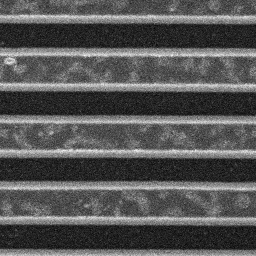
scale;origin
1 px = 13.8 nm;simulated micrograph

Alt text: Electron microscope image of one or a few lines or trenches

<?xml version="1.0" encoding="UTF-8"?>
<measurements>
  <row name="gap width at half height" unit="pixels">32.5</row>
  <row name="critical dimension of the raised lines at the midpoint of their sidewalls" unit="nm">484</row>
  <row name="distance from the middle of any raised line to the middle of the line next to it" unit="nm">920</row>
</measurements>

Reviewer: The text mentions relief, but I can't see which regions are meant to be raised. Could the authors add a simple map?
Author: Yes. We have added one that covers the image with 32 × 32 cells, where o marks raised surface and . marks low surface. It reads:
oooooooooooooooooooooooooooooooo
oooooooooooooooooooooooooooooooo
................................
................................
................................
................................
................................
oooooooooooooooooooooooooooooooo
oooooooooooooooooooooooooooooooo
oooooooooooooooooooooooooooooooo
oooooooooooooooooooooooooooooooo
................................
................................
................................
................................
oooooooooooooooooooooooooooooooo
oooooooooooooooooooooooooooooooo
oooooooooooooooooooooooooooooooo
oooooooooooooooooooooooooooooooo
................................
................................
................................
................................
oooooooooooooooooooooooooooooooo
oooooooooooooooooooooooooooooooo
oooooooooooooooooooooooooooooooo
oooooooooooooooooooooooooooooooo
ooo..........ooooooooooooooooooo
................................
................................
................................
................................